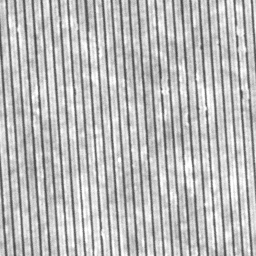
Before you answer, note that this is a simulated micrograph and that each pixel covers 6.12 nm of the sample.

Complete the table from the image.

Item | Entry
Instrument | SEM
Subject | parallel lines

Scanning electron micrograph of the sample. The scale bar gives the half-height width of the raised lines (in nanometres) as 33.6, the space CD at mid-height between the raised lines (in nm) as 16.8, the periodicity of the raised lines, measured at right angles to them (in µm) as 0.0535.